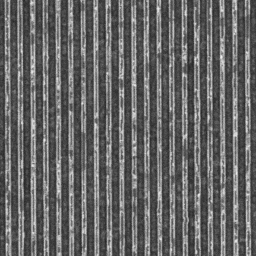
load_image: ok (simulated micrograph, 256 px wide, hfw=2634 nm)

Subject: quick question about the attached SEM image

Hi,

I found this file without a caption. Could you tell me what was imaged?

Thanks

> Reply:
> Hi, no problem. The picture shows parallel lines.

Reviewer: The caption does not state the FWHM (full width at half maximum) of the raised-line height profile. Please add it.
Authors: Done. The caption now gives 0.0476 um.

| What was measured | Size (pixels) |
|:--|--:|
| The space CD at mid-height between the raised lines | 8.38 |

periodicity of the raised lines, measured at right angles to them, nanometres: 130